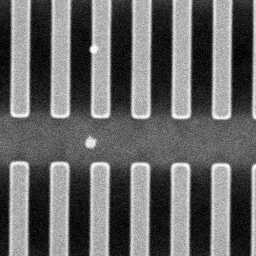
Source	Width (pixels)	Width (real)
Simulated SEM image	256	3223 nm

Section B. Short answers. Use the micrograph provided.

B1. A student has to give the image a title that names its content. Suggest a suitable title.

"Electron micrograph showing groups of lines, slits or small figures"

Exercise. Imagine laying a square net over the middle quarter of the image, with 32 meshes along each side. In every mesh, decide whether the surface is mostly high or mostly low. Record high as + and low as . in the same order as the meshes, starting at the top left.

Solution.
+......++++......++++......+++++
+......++++......++++......+++++
+......++++......++++......+++++
+......++++......++++......+++++
+......++++......++++......+++++
+......++++......++++......+++++
+......++++......++++......+++++
+......++++......++++......+++++
+......++++......++++......+++++
+......++++......++++......+++++
+......++++......++++......+++++
+......++++......++++......+++++
+......++++......++++......++++.
................................
................................
................................
................................
................................
................................
................................
................................
................................
................................
................................
................................
+......++++......++++......++++.
+......++++......++++......++++.
+......++++......++++......++++.
+......++++......++++......++++.
+......++++......++++......++++.
+......++++......++++......++++.
+......++++......++++......++++.